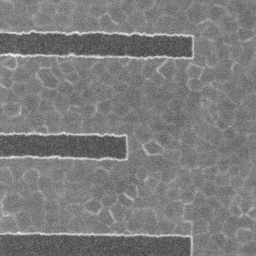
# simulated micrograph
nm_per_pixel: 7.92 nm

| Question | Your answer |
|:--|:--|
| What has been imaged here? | one or a few lines or trenches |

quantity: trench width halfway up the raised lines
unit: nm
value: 609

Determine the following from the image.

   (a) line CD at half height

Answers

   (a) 185 nanometres